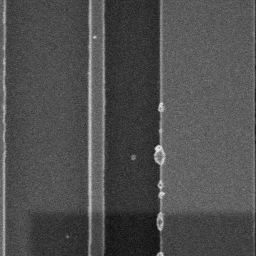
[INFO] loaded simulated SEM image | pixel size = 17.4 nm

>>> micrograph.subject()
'lines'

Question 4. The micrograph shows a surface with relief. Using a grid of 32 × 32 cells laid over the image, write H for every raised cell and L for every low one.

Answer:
HLLLLLLLLLLHHLLLLLLLHHHHHHHHHHHH
HLLLLLLLLLLHHLLLLLLLHHHHHHHHHHHH
HLLLLLLLLLLHHLLLLLLLHHHHHHHHHHHH
HLLLLLLLLLLHHLLLLLLLHHHHHHHHHHHH
HLLLLLLLLLLHHLLLLLLLHHHHHHHHHHHH
HLLLLLLLLLLHHLLLLLLLHHHHHHHHHHHH
HLLLLLLLLLLHHLLLLLLLHHHHHHHHHHHH
HLLLLLLLLLLHHLLLLLLLHHHHHHHHHHHH
HLLLLLLLLLLHHLLLLLLLHHHHHHHHHHHH
HLLLLLLLLLLHHLLLLLLLHHHHHHHHHHHH
HLLLLLLLLLLHHLLLLLLLHHHHHHHHHHHH
HLLLLLLLLLLHHLLLLLLLHHHHHHHHHHHH
HLLLLLLLLLLHHLLLLLLLHHHHHHHHHHHH
HLLLLLLLLLLHHLLLLLLLHHHHHHHHHHHH
HLLLLLLLLLLHHLLLLLLLHHHHHHHHHHHH
HLLLLLLLLLLHHLLLLLLLHHHHHHHHHHHH
HLLLLLLLLLLHHLLLLLLLHHHHHHHHHHHH
HLLLLLLLLLLHHLLLLLLLHHHHHHHHHHHH
HLLLLLLLLLLHHLLLLLLLHHHHHHHHHHHH
HLLLLLLLLLLHHLLLLLLHHHHHHHHHHHHH
HLLLLLLLLLLHHLLLLLLLHHHHHHHHHHHH
HLLLLLLLLLLHHLLLLLLLHHHHHHHHHHHH
LLLLLLLLLLLHHLLLLLLLHHHHHHHHHHHH
HLLLLLLLLLLHHLLLLLLLHHHHHHHHHHHH
HLLLLLLLLLLHHLLLLLLLHHHHHHHHHHHH
LLLLLLLLLLLHHLLLLLLLHHHHHHHHHHHH
LLLLLLLLLLLHHLLLLLLLHHHHHHHHHHHH
HLLLLLLLLLLHHLLLLLLLHHHHHHHHHHHH
HLLLLLLLLLLHHLLLLLLLHHHHHHHHHHHH
LLLLLLLLLLLHHLLLLLLLHHHHHHHHHHHH
LLLLLLLLLLLHHLLLLLLLHHHHHHHHHHHH
LLLLLLLLLLLHHLLLLLLLHHHHHHHHHHHH